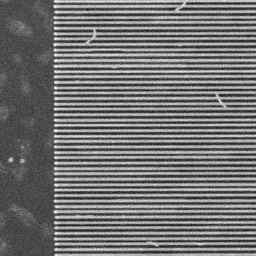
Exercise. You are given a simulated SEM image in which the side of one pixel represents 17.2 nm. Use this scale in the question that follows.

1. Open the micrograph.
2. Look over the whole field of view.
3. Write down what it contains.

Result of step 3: parallel lines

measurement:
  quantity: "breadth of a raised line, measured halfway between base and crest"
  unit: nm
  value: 40.9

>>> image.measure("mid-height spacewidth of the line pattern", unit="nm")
55.9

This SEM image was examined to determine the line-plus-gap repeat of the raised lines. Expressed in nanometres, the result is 92.9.